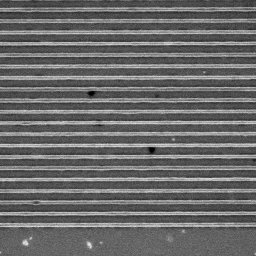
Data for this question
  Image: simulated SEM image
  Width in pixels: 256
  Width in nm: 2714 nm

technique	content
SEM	parallel lines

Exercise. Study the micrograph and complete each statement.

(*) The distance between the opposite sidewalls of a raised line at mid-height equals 0.0305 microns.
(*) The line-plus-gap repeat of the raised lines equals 11.3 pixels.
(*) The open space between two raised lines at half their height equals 82.1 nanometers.